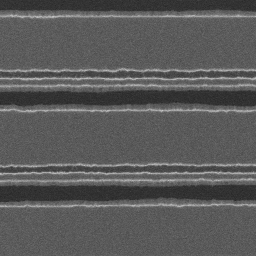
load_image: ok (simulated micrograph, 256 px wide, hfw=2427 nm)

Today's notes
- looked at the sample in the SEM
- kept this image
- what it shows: lines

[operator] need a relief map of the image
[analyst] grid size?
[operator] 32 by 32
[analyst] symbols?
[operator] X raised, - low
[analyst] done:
--------------------------------
--------------------------------
XXXXXXXXXXXXXXXXXXXXXXXXXXXXXXXX
XXXXXXXXXXXXXXXXXXXXXXXXXXXXXXXX
XXXXXXXXXXXXXXXXXXXXXXXXXXXXXXXX
XXXXXXXXXXXXXXXXXXXXXXXXXXXXXXXX
XXXXXXXXXXXXXXXXXXXXXXXXXXXXXXXX
XXXXXXXXXXXXXXXXXXXXXXXXXXXXXXXX
XXXXXXXXXXXXXXXXXXXXXXXXXXXXXXXX
XXXXXXXXXXXXXXXXXXXXXXXXXXXXXXXX
XXXXXXXXXXXXXXXXXXXXXXXXXXXXXXXX
--------------------------------
--------------------------------
--------------------------------
XXXXXXXXXXXXXXXXXXXXXXXXXXXXXXXX
XXXXXXXXXXXXXXXXXXXXXXXXXXXXXXXX
XXXXXXXXXXXXXXXXXXXXXXXXXXXXXXXX
XXXXXXXXXXXXXXXXXXXXXXXXXXXXXXXX
XXXXXXXXXXXXXXXXXXXXXXXXXXXXXXXX
XXXXXXXXXXXXXXXXXXXXXXXXXXXXXXXX
XXXXXXXXXXXXXXXXXXXXXXXXXXXXXXXX
XXXXXXXXXXXXXXXXXXXXXXXXXXXXXXXX
XXXXXXXXXXXXXXXXXXXXXXXXXXXXXXXX
--------------------------------
--------------------------------
---------------X-XXXXXXXXXXXXXXX
XXXXXXXXXXXXXXXXXXXXXXXXXXXXXXXX
XXXXXXXXXXXXXXXXXXXXXXXXXXXXXXXX
XXXXXXXXXXXXXXXXXXXXXXXXXXXXXXXX
XXXXXXXXXXXXXXXXXXXXXXXXXXXXXXXX
XXXXXXXXXXXXXXXXXXXXXXXXXXXXXXXX
XXXXXXXXXXXXXXXXXXXXXXXXXXXXXXXX